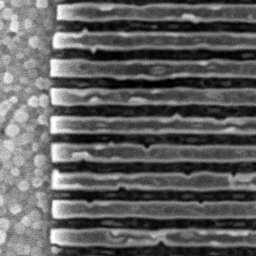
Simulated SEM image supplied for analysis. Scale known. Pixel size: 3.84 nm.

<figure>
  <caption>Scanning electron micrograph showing parallel lines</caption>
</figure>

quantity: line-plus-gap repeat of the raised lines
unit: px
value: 28.1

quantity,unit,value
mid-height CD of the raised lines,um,0.0605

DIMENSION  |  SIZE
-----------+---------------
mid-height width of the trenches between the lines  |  12 pixels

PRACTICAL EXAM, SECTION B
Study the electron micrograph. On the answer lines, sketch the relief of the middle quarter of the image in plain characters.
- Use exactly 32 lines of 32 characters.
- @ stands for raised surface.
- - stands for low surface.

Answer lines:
@@@@@@@@@@@@@@@@@@@@@@@@@@@@@@@@
@@@@@@@@@@@@@@@@@@@@@@@@@@@@@@@@
@@@@@@@@@@@@@@@@@@@@@@@@@@@@@@@@
------------@@@@@@@@@@@@@@@@----
--------------------------------
--------------------------------
@@@@@@@@@@@--@@@@@@@@@@@@@@@@@@@
@@@@@@@@@@@@@@@@@@@@@@@@@@@@@@@@
@@@@@@@@@@@@@@@@@@@@@@@@@@@@@@@@
@@@@@@@@@@@@@@@@@@@@@@@@@@@@@@@@
--------------------------------
--------------------------------
--------------------------------
@@@@@@@@@-----------------@@@@--
@@@@@@@@@@@@@@@@@@@@@@@@@@@@@@@@
@@@@@@@@@@@@@@@@@@@@@@@@@@@@@@@@
@@@@@@@@@@@@@@@@@@@@@@@@@@@@@@@@
--------------------------------
--------------------------------
--------------------------------
@@@@@@@@@@@@@@@@@@@@--@@@@@@----
@@@@@@@@@@@@@@@@@@@@@@@@@@@@@@@@
@@@@@@@@@@@@@@@@@@@@@@@@@@@@@@@@
@@@@@@@@@@@@@@@@@@@@@@@@@@@@@@@@
--------------------------------
--------------------------------
--------------------------------
----@@-------------@@-----@@@@--
@@@@@@@@@@@@@@@@@@@@@@@@@@@@@@@@
@@@@@@@@@@@@@@@@@@@@@@@@@@@@@@@@
@@@@@@@@@@@@@@@@@@@@@@@@@@@@@@@@
--------------------------------